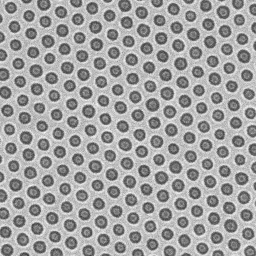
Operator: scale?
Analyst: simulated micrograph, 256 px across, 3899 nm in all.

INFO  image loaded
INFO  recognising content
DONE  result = a regular array of ring-shaped grooves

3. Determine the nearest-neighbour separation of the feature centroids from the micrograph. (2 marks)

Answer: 271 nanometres